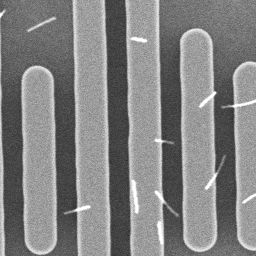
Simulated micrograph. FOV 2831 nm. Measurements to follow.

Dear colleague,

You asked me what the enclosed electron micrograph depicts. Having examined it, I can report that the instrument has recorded groups of lines, slits or small figures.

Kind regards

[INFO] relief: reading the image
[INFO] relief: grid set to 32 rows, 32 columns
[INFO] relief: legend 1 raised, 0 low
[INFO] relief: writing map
00000000011110001111000000000000
00000000011110001111000000000000
00000000011110001111000000000000
00000000011110001111000000000000
00000000011110001111000111000000
00000000011110001111000111100000
00000000011110001111000111100000
00000000011110001111000111100000
00001100011110001111000111100011
00011110011110001111000111100111
00011110011110001111000111100111
00011110011110001111000111100111
00011110011110001111000111100111
00011110001110001111000111100111
00011110001110001111000111100111
00011110001110001111000111100111
00011110011110001111000111100111
00011110011110001111000111100111
00011110001110001111000111100011
00011110001110001111000111100011
00011110001111001111000111100011
00011110001111001111000111100011
00011110001111001111000111100011
00011110001111001111000111100011
00011110001111001111000111100011
00011110001111001111000111100011
00011110001111001111000111100011
00011110001111001111000111100011
00011110001111001111000111100011
10011110001111001111000111100011
10011110001111001111000111100011
10001100001111001111000000000000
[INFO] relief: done